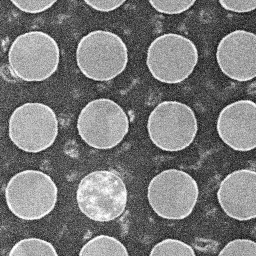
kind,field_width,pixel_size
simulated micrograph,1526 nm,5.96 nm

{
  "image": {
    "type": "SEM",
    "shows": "a regular array of raised bodies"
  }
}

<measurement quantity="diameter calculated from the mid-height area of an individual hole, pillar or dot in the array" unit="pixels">49.6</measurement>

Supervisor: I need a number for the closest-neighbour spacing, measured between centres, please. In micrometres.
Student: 0.404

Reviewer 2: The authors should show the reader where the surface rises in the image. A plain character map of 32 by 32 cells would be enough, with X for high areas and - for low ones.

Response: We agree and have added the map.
--XXXX-----XXXX----XXXXX----XXXX
--------------------XXX---------
--------------------------------
--------------------------------
---XXX-----XXXX-----XX------XXXX
--XXXXX---XXXXX----XXXXX---XXXXX
-XXXXXX---XXXXXX---XXXXXX--XXXXX
-XXXXXX---XXXXXX--XXXXXXX--XXXXX
--XXXXX---XXXXXX---XXXXX----XXXX
--XXXX-----XXX-----XXXXX----XXXX
--------------------------------
--------------------------------
------------XX------------------
--XXXX-----XXXX----XXXXX----XXXX
--XXXXX---XXXXXX---XXXXX---XXXXX
-XXXXXX---XXXXXX---XXXXXX--XXXXX
-XXXXXX---XXXXXX---XXXXXX--XXXXX
--XXXXX----XXXX----XXXXX----XXXX
---XXX--------------XXX------XXX
--------------------------------
--------------------------------
---XX---------------XXX------XXX
-XXXXX-------------XXXXX----XXXX
-XXXXXX------------XXXXXX--XXXXX
-XXXXXX------------XXXXXX--XXXXX
-XXXXXX------------XXXXX----XXXX
--XXXX--------------XXXX----XXXX
--------------------------------
--------------------------------
--------------------------------
--XXXX-----XXXX-----XXX------XXX
-XXXXXX---XXXXXX---XXXXX----XXXX